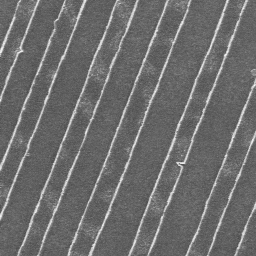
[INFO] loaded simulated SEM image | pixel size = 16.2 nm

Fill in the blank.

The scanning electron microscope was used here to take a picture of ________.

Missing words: parallel lines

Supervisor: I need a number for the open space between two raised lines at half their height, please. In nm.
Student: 483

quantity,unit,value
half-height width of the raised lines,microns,0.318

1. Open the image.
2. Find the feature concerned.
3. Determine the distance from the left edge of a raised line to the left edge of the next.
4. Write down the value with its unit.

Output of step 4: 827 nm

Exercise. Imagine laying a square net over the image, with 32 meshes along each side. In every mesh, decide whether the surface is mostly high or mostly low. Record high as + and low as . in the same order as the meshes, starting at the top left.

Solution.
..+++...+++...+++....+++....+++.
..++....++....+++...+++.....++..
..++...+++....++....+++....+++..
.++....++....+++....+++....+++..
.++...+++....+++...+++.....++...
+++...+++...+++....+++....+++...
++....++....+++...+++.....++....
++...+++....++....+++.....++....
++...++....+++....+++....+++....
+...+++....+++...+++.....++.....
+...+++....++....+++....+++.....
....++....+++...+++.....++.....+
...+++....++....+++.....++.....+
...++....+++....+++....+++.....+
..+++....+++...+++.....++.....++
..+++....++....+++....+++.....++
..++....+++....++.....++.....+++
.+++....+++...+++.....++.....+++
.+++...+++....+++....+++.....++.
.++....+++...+++.....++.....+++.
+++....++....+++....+++.....++..
++....+++....+++....+++....+++..
++....++....+++.....++.....+++..
+....+++....+++....+++.....++...
+....+++...+++.....++.....+++...
+....++....+++.....++.....+++...
....+++....+++....+++.....++....
....+++...+++.....++.....+++...+
....++....+++....+++.....++....+
...+++...+++.....++.....+++...++
...++....+++.....++.....+++...++
..+++....++.....+++....+++...+++